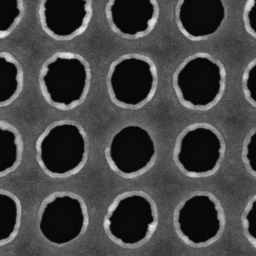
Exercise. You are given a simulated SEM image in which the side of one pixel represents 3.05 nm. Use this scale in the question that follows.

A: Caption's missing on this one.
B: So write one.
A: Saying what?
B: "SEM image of a regular array of holes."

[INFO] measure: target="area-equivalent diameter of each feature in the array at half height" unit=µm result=0.135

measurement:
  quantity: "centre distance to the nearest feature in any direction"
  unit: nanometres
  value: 207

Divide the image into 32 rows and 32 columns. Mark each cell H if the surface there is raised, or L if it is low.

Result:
LLHHHHLLLLLHHHLLLLLHHHHLLLLLHHHH
LLHHHHLLLLLHHHLLLLLHHHLLLLLLHHHL
LLHHHHLLLLHHHHLLLLLHHHLLLLLLHHHL
LHHHHHLLLLHHHHHLLLHHHHHLLLLHHHHH
HHHHHHHHHHHHHHHHHHHHHHHHLHHHHHHH
HHHHHHHHHHHHHHHHHHHHHHHHHHHHHHHH
HHHHHHHHHHHHHHHHHHHHHHHHHHHHHHHH
LHHHHHHLLLHHHHHLLLHHHHHHLLHHHHHH
LLHHHHLLLLLHHHLLLLLHHHHLLLLHHHHH
LLHHHHLLLLLHHHLLLLLHHHLLLLLLHHHL
LLHHHHLLLLLHHHLLLLLHHHLLLLLHHHHL
LLHHHHLLLLHHHHLLLLLHHHHLLLLHHHHL
LHHHHHHLLLHHHHHLLLHHHHHLLLLHHHHH
HHHHHHHHHHHHHHHHHHHHHHHHHHHHHHHH
HHHHHHHHHHHHHHHHHHHHHHHHHHHHHHHH
HHHHHHHHLHHHHHHHHHHHHHHHHHHHHHHH
LHHHHHLLLLHHHHHLLLHHHHHHLLLHHHHH
LLHHHLLLLLHHHHLLLLLHHHHLLLLHHHHL
LLHHHLLLLLLHHHLLLLLHHHHLLLLLHHHL
LLHHHLLLLLHHHHLLLLLHHHLLLLLHHHHL
LLHHHHLLLLHHHHLLLLHHHHHLLLLHHHHL
HHHHHHHLHHHHHHHLLHHHHHHHLHHHHHHH
HHHHHHHHHHHHHHHHHHHHHHHHHHHHHHHH
HHHHHHHHHHHHHHHHHHHHHHHHHHHHHHHH
LHHHHHHHHHHHHHHHHHHHHHHHHHHHHHHH
LLHHHHLLLLHHHHHLLLLHHHHLLLLHHHHH
LLHHHLLLLLHHHHLLLLLHHHLLLLLHHHHL
LLHHHLLLLLHHHHLLLLLHHHLLLLLHHHHL
LLHHHLLLLLHHHHLLLLLHHHHLLLLHHHHL
LHHHHHLLLLHHHHLLLLHHHHHLLLLHHHHH
HHHHHHHHHHHHHHHHHHHHHHHHHHHHHHHH
HHHHHHHHHHHHHHHHHHHHHHHHHHHHHHHH